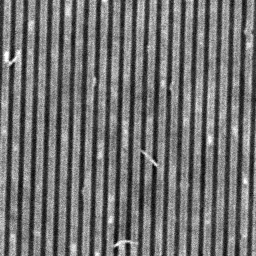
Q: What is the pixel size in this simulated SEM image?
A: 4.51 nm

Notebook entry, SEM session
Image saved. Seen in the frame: parallel lines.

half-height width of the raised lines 28.7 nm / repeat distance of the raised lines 54.7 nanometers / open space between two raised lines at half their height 24.8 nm